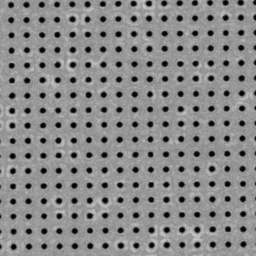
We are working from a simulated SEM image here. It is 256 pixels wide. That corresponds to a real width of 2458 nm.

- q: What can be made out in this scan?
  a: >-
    a regular array of holes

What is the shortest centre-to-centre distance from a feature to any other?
142 nm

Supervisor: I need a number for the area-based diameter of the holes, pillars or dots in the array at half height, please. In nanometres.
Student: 60.3